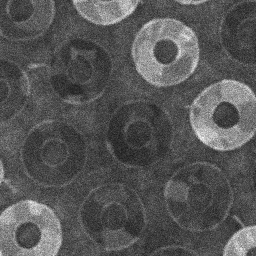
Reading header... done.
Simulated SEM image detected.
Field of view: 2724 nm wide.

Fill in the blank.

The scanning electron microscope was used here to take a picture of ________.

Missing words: ring-shaped raised bodies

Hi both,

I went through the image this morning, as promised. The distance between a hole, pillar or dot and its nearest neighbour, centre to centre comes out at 913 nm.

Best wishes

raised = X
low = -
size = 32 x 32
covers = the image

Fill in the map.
X---XXX--XXXXXXXX-------------XX
X---XXX---XXXXXX-------------XXX
XX-XXX-----XXXX-----XX------XXX-
XXXXXX------------XXXXXX----XX--
XXXXX------------XXXXXXX----XX--
--------XXXX-----XX---XXX---XX--
-------XXXXXX----XX---XXX---XXXX
X-----XXX--XXX---XX---XXX----XXX
XXX---XX----XX---XXXXXXX--------
XXX---XX---XXX----XXXXX---------
-XXX--XXXXXXX------XXX-----XXX--
-XXX---XXXXXX------------XXXXXX-
-XX-----XXXX-----X------XXXXXXXX
XXX------------XXXXX----XXX---XX
XX------------XXXXXXX---XXX---XX
-----XXXX-----XX---XXX--XXX---XX
----XXXXXX---XXX---XXX---XXXXXXX
---XXX-XXXX--XXX---XXX---XXXXXX-
---XX---XXX---XXXXXXX------XX---
---XX---XXX---XXXXXXX-----------
---XXX-XXXX----XXXX-----XX------
---XXXXXXX------------XXXXXX---X
----XXXXX------------XXXXXXX---X
------------XXXX-----XXX--XXX---
-----------XXXXXX----XX----XX---
--XXX-----XXXX-XXX---XXX--XXX---
XXXXXX----XXX---XX---XXXXXXX----
XXXXXXX---XXX---XX----XXXXXX----
XX---XXX--XXX--XXX-----XXXX----X
XX---XXX---XXXXXX------------XXX
XX---XXX----XXXX-------------XXX
XXXXXXX------------XXXXX----XXX-